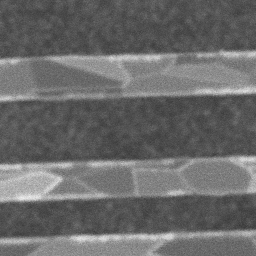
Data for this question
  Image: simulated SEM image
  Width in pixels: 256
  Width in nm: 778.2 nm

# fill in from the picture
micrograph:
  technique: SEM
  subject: one or a few lines or trenches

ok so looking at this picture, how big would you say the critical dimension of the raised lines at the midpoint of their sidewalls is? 110 nm